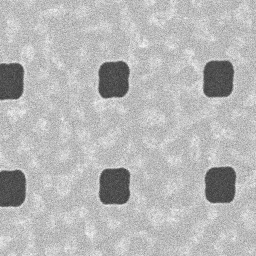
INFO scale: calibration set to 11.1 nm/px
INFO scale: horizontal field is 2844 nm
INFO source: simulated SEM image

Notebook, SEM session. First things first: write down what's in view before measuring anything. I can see holes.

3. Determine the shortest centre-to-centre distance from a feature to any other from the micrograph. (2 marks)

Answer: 1170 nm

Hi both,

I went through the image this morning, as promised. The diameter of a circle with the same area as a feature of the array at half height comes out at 407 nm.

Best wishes